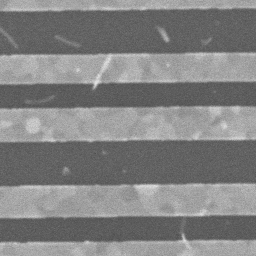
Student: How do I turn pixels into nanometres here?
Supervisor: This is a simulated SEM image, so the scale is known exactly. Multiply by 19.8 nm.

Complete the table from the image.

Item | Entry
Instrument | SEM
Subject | lines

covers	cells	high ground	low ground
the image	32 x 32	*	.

********************************
................................
................................
................................
................................
................................
................................
********************************
********************************
********************************
................................
................................
................................
...................*************
********************************
********************************
********************************
****************................
................................
................................
................................
................................
................................
********************************
********************************
********************************
********************************
................................
................................
................................
********************************
********************************